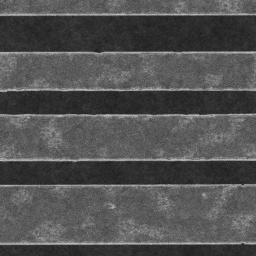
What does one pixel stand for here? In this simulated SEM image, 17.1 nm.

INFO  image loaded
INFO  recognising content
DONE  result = one or a few lines or trenches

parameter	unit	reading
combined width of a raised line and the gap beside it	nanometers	1220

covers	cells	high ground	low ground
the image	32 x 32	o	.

oooooooooooooooooooooooooooooooo
oooooooooooooooooooooooooooooooo
................................
................................
................................
................................
................................
oooooooooooooooooooooooooooooooo
oooooooooooooooooooooooooooooooo
oooooooooooooooooooooooooooooooo
oooooooooooooooooooooooooooooooo
................................
................................
................................
ooooooooooooooooooo.oooooooooooo
oooooooooooooooooooooooooooooooo
oooooooooooooooooooooooooooooooo
oooooooooooooooooooooooooooooooo
oooooooooooooooooooooooooooooooo
oooooooooooooooooooooooooooooooo
................................
................................
................................
oooooooooooooooooooooooooooooooo
oooooooooooooooooooooooooooooooo
oooooooooooooooooooooooooooooooo
oooooooooooooooooooooooooooooooo
oooooooooooooooooooooooooooooooo
oooooooooooooooooooooooooooooooo
oooooooooooooooooooooooooooooooo
................................
................................